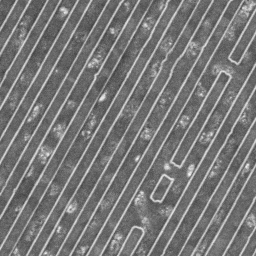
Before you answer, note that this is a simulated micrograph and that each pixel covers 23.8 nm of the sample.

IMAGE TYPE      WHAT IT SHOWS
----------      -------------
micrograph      parallel lines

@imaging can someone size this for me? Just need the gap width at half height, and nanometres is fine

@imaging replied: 369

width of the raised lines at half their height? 276 nanometers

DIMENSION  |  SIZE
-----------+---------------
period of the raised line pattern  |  633 nanometres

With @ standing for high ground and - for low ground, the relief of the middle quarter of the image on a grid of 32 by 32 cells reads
--@@@-----@@@----@@@----@@@@----
--@@-----@@@-----@@@----@@@-----
-@@@----@@@@----@@@-----@@@----@
@@@-----@@@-----@@@----@@@-----@
@@@----@@@@----@@@-----@@@----@@
@@-----@@@-----@@@----@@@-----@@
@@----@@@-----@@@----@@@-----@@@
@-----@@@----@@@@----@@@-----@@@
@----@@@-----@@@----@@@-----@@@-
-----@@@----@@@@----@@@-----@@@-
----@@@-----@@@----@@@-----@@@--
----@@@----@@@-----@@@----@@@---
---@@@-----@@@----@@@-----@@@---
---@@@----@@@-----@@@----@@@----
--@@@-----@@@----@@@-----@@@----
-@@@-----@@@----@@@@----@@@-----
-@@@----@@@-----@@@-----@@@----@
@@@-----@@@----@@@@----@@@----@@
@@@----@@@-----@@@-----@@@----@@
@@-----@@@----@@@-----@@@----@@@
@@----@@@-----@@@----@@@-----@@@
@-----@@@----@@@-----@@@----@@@-
-----@@@-----@@@----@@@-----@@@-
----@@@@----@@@----@@@@----@@@--
----@@@----@@@@----@@@-----@@@--
---@@@@----@@@----@@@@------@---
---@@@----@@@@----@@@-----------
--@@@-----@@@----@@@------------
--@@@----@@@-----@@@----@@------
-@@@-----@@@----@@@-----@@@----@
-@@@----@@@-----@@@----@@@-----@
@@@----@@@@----@@@-----@@@----@@